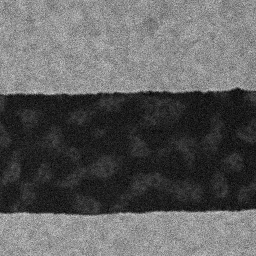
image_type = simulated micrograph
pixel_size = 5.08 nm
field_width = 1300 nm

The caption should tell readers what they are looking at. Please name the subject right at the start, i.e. one or a few lines or trenches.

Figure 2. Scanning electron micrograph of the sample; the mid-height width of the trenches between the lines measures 611 nanometers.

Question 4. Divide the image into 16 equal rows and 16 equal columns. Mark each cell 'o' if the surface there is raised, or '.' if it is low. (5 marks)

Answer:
oooooooooooooooo
oooooooooooooooo
oooooooooooooooo
oooooooooooooooo
oooooooooooooooo
oooooooooooooooo
................
................
................
................
................
................
................
oooooooooooooooo
oooooooooooooooo
oooooooooooooooo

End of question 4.